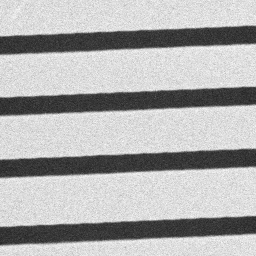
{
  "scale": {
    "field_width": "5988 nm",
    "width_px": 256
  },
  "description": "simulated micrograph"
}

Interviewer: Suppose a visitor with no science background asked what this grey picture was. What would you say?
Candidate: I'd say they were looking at lines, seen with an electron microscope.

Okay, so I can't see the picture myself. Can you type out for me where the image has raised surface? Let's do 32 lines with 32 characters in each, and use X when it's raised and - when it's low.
XXXXXXXXXXXXXXXXXXXXXXXXXXXXXXXX
XXXXXXXXXXXXXXXXXXXXXXXXXXXXXXXX
XXXXXXXXXXXXXXXXXXXXXXXXXXXXXXXX
XXXXXXXXXXXXXXXXXXXXXXX---------
--------------------------------
--------------------------------
---------XXXXXXXXXXXXXXXXXXXXXXX
XXXXXXXXXXXXXXXXXXXXXXXXXXXXXXXX
XXXXXXXXXXXXXXXXXXXXXXXXXXXXXXXX
XXXXXXXXXXXXXXXXXXXXXXXXXXXXXXXX
XXXXXXXXXXXXXXXXXXXXXXXXXXXXXXXX
XXXXXXXXXXXXXXX-----------------
--------------------------------
-----------------------XXXXXXXXX
-XXXXXXXXXXXXXXXXXXXXXXXXXXXXXXX
XXXXXXXXXXXXXXXXXXXXXXXXXXXXXXXX
XXXXXXXXXXXXXXXXXXXXXXXXXXXXXXXX
XXXXXXXXXXXXXXXXXXXXXXXXXXXXXXXX
XXXXXXXXXXXXXXXXXXXXXXXXXXXXXXXX
XXXXXXXXXXX---------------------
--------------------------------
-------------------XXXXXXXXXXXXX
XXXXXXXXXXXXXXXXXXXXXXXXXXXXXXXX
XXXXXXXXXXXXXXXXXXXXXXXXXXXXXXXX
XXXXXXXXXXXXXXXXXXXXXXXXXXXXXXXX
XXXXXXXXXXXXXXXXXXXXXXXXXXXXXXXX
XXXXXXXXXXXXXXXXXXXXXXXXXXXXXXXX
XXXXXXXXXXXXXXXXXX--------------
--------------------------------
--------------------------XXXXXX
---XXXXXXXXXXXXXXXXXXXXXXXXXXXXX
XXXXXXXXXXXXXXXXXXXXXXXXXXXXXXXX